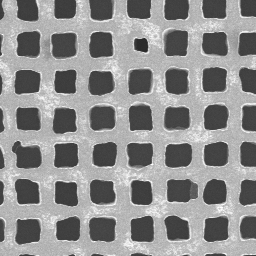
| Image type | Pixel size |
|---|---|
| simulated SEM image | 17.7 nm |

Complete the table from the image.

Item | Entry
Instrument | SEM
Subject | a regular array of holes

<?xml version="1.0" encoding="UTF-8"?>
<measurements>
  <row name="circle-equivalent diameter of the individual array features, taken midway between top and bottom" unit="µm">0.469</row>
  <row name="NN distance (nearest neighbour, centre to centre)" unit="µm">0.629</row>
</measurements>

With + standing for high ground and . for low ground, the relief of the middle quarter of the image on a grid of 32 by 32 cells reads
++++++++++++++++++++++++++++++++
+..++++++++++++++.....++++....++
...++++.....++++......+++......+
...+++......++++......+++......+
...+++.......+++......+++......+
...+++.......+++......+++......+
...+++......++++......++++.....+
..+++++...+++++++.+++++++++....+
++++++++++++++++++++++++++++++++
++++++++++++++++++++++++++++++++
++++++++.++++++++....+++++.+++++
...++++......+++......+++......+
...+++.......+++......+++......+
...+++.......+++......+++.......
...+++.......+++......+++.......
...+++.......+++......+++.......
...++++..++++++++.....++++....++
++++++++++++++++++++++++++++++++
++++++++++++++++++++++++++++++++
+++++++++++.++++++++++++++++++++
...++++......+++......++++......
....+++......+++......+++.......
....+++......+++......+++.......
....+++......+++......+++.......
....+++......+++......+++.......
...+++++....++++.....+++++....++
++++++++++++++++++++++++++++++++
++++++++++++++++++++++++++++++++
++++++++++++++++++++++++++++++++
+..++++.....+++++....+++++......
...+++......+++++.....++++......
...+++......+++++.....++++......